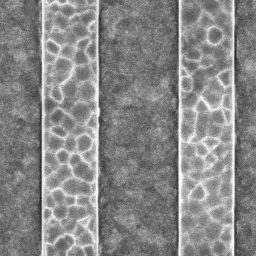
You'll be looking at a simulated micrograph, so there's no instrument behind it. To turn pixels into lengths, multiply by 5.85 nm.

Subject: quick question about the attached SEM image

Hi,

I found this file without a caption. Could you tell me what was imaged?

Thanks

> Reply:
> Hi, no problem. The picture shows one or a few lines or trenches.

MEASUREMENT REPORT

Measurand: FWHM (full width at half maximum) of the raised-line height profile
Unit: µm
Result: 0.32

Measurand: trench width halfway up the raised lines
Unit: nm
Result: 478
